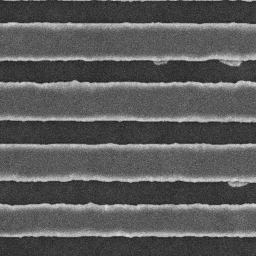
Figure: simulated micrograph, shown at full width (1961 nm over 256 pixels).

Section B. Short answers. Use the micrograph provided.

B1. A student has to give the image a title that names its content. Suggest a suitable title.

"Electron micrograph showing lines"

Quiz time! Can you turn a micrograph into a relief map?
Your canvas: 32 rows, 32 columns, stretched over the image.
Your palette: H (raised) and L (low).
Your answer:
LLLLLLLLLLLLLLLLLLLLLLLLLLLLLLLL
LLLLLLLLLLLLLLLLLLLLLLLLLLLLLLLL
LLLLLLLLLLLLLLLLLLLLLLLLLLLLLLLL
HHHHHHHHHHHHHHHHHHHHHHHHHHHHHHHH
HHHHHHHHHHHHHHHHHHHHHHHHHHHHHHHH
HHHHHHHHHHHHHHHHHHHHHHHHHHHHHHHH
HHHHHHHHHHHHHHHHHHHHHHHHHHHHHHHH
HHHHHLLLLLHHHLLLLLLHLLLHHHLLLLLL
LLLLLLLLLLLLLLLLLLLLLLLLLLLLLLLL
LLLLLLLLLLLLLLLLLLLLLLLLLLLLLLLL
HHHHHHHHHHHHHHHHHHHHHHHHHHHHHHHH
HHHHHHHHHHHHHHHHHHHHHHHHHHHHHHHH
HHHHHHHHHHHHHHHHHHHHHHHHHHHHHHHH
HHHHHHHHHHHHHHHHHHHHHHHHHHHHHHHH
HHHHHHHHHHHHHHHHHHHHHHHHHHHHHHHH
LLLLLLLLLLLLLLLLLLLLLLLLLLLLLLLL
LLLLLLLLLLLLLLLLLLLLLLLLLLLLLLLL
LLLLLLLLLLLLLLLLLLLLLLLLLLLLLLLL
HHHHHHHHHHHHHHHHHHHHHHHHHHHHHHHH
HHHHHHHHHHHHHHHHHHHHHHHHHHHHHHHH
HHHHHHHHHHHHHHHHHHHHHHHHHHHHHHHH
HHHHHHHHHHHHHHHHHHHHHHHHHHHHHHHH
LHHHHHHHHLLLHHHHHHHHHHHHHHHHHHHH
LLLLLLLLLLLLLLLLLLLLLLLLLLLLLLLL
LLLLLLLLLLLLLLLLLLLLLLLLLLLLLLLL
LLLLLHLHLLLHLLLLLLLLLLLLHLLLLLLH
HHHHHHHHHHHHHHHHHHHHHHHHHHHHHHHH
HHHHHHHHHHHHHHHHHHHHHHHHHHHHHHHH
HHHHHHHHHHHHHHHHHHHHHHHHHHHHHHHH
HHHLLLLHHHLLHHLLHLLLHLHLHHHHHHHL
LLLLLLLLLLLLLLLLLLLLLLLLLLLLLLLL
LLLLLLLLLLLLLLLLLLLLLLLLLLLLLLLL